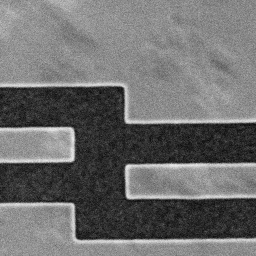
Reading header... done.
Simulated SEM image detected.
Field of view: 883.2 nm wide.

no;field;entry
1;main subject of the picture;groups of lines, slits or small figures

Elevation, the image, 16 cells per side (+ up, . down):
++++++++++++++++
++++++++++++++++
++++++++++++++++
++++++++++++++++
++++++++++++++++
.......+++++++++
........++++++++
........++++++++
+++++...........
+++++...........
........++++++++
........++++++++
................
+++++...........
+++++...........
++++++++++++++++